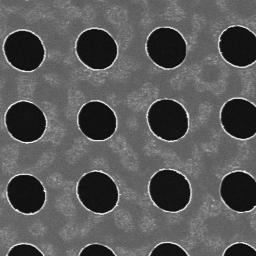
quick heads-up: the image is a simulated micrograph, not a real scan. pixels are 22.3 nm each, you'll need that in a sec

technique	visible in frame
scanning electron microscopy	a regular array of holes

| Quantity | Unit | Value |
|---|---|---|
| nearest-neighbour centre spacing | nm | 1590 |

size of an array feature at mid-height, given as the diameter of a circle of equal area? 900 nm